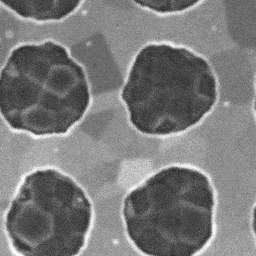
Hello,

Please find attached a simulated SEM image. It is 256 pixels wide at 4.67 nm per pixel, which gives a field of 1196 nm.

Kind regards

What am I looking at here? holes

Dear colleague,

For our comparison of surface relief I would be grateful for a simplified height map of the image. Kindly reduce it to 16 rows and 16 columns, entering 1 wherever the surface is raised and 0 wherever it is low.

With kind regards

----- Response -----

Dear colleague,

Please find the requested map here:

1000011110001111
1111111111111111
1111111111111111
1000111110001111
0000011100000111
0000001100000011
0000001100000111
0000011100001111
1111111111111111
1111111111111111
1111111111101111
1000011110000111
1000001100000111
0000001100000111
0000001100000111
1000011110000111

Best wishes